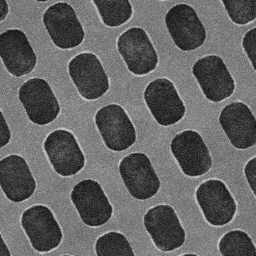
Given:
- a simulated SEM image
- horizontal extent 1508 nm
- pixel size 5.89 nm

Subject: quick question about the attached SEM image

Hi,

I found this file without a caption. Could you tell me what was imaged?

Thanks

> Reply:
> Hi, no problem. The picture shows a regular array of holes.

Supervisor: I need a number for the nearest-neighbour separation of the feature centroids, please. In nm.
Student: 323